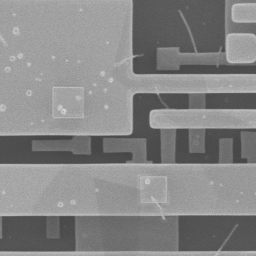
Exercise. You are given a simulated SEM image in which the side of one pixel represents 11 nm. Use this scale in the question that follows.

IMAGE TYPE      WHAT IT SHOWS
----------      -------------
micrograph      wiring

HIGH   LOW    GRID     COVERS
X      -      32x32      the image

XXXXXXXXXXXXXXXXX-------------XX
XXXXXXXXXXXXXXXXX------------XXX
XXXXXXXXXXXXXXXXX------------XXX
XXXXXXXXXXXXXXXX----------------
XXXXXXXXXXXXXXXX-------------XXX
XXXXXXXXXXXXXXXX------------XXXX
XXXXXXXXXXXXXXXXX-----------XXXX
XXXXXXXXXXXXXXXXX-----------XXXX
XXXXXXXXXXXXXXXXX---------------
XXXXXXXXXXXXXXXXXXXXXXXXXXXXXXXX
XXXXXXXXXXXXXXXXXXXXXXXXXXXXXXXX
XXXXXXXXXXXXXXXXXXXXXXXXXXXXXXXX
XXXXXXXXXXXXXXXXX---------------
XXXXXXXXXXXXXXXXX---------------
XXXXXXXXXXXXXXXXX--XXXXXXXXXXXXX
XXXXXXXXXXXXXXXXX--XXXXXXXXXXXXX
XXXXXXXXXXXXXXXX----------------
--------------------------------
--------------------------------
--------------------------------
------------XXXXXXXXXXXXXXXXXXXX
XXXXXXXXXXXXXXXXXXXXXXXXXXXXXXXX
XXXXXXXXXXXXXXXXXXXXXXXXXXXXXXXX
XXXXXXXXXXXXXXXXXXXXXXXXXXXXXXXX
XXXXXXXXXXXXXXXXXXXXXXXXXXXXXXXX
XXXXXXXXXXXXXXXXXXXXXXXXXXXXXXXX
XXXXXXXXXXXXXXXXXXXXXXXXXXXXXXXX
--------------------------------
--------------------------------
--------------------------------
--------------------------------
---------------------------X---X